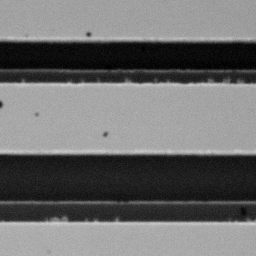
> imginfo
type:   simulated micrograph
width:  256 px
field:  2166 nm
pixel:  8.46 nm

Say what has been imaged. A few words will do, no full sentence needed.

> lines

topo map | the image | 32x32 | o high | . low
oooooooooooooooooooooooooooooooo
oooooooooooooooooooooooooooooooo
oooooooooooooooooooooooooooooooo
oooooooooooooooooooooooooooooooo
oooooooooooooooooooooooooooooooo
................................
................................
................................
................................
................................
ooooooooooooooooooooooooooooooo.
oooooooooooooooooooooooooooooooo
oooooooooooooooooooooooooooooooo
oooooooooooooooooooooooooooooooo
oooooooooooooooooooooooooooooooo
oooooooooooooooooooooooooooooooo
oooooooooooooooooooooooooooooooo
oooooooooooooooooooooooooooooooo
oooooooooooooooooooooooooooooooo
................................
................................
................................
................................
................................
................................
................................
................................
......oo........................
oooooooooooooooooooooooooooooooo
oooooooooooooooooooooooooooooooo
oooooooooooooooooooooooooooooooo
oooooooooooooooooooooooooooooooo